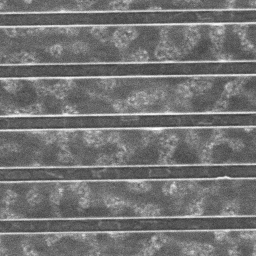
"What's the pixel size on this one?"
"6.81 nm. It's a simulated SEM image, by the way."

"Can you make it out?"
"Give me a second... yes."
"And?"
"parallel lines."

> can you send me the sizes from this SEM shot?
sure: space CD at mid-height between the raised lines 86.8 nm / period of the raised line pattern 352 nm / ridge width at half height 0.266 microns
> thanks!